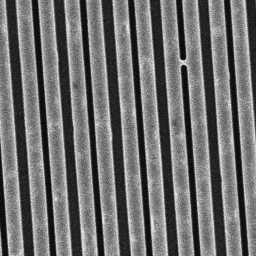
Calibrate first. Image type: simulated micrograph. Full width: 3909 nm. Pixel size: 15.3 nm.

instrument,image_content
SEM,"parallel lines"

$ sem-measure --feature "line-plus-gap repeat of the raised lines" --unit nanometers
365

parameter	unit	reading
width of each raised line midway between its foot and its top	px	15.6